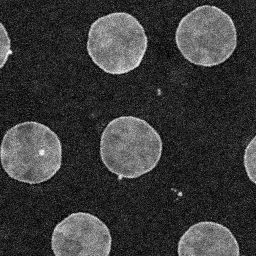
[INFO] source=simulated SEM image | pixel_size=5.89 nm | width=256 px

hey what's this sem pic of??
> raised bodies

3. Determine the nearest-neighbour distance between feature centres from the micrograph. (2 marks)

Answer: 558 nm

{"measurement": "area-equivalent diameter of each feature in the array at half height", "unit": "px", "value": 60.2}